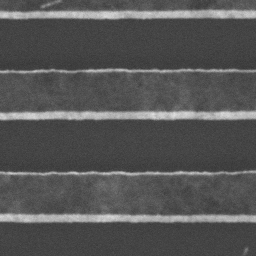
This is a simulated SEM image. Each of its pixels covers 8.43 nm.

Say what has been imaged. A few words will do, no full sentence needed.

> lines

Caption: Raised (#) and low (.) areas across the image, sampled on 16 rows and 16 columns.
################
................
................
................
################
################
################
................
................
................
................
################
################
################
................
................